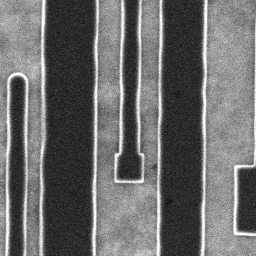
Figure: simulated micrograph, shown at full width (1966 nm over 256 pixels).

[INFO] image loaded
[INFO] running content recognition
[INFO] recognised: groups of lines, slits or small figures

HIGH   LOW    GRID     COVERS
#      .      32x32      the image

.....#######...###..######......
.....#######...###..######......
.....#######...##...######......
.....#######...##...######......
.....#######...##...######......
.....#######...###..######......
.....#######...###..######......
.....#######...###..######......
.....#######...##...######......
..#..#######...##...######......
.##..#######...##...######......
.##..#######...##...######......
.##..#######...##...######......
.##..#######...##...######......
.##..#######...##...######......
.##..#######...##...######......
.##..#######...##...######......
.##..#######...##...######......
.##..#######...##...######......
.##..#######...###..######......
.##..#######..####..######......
.##..#######..####..######...###
.##..#######...###..######...###
.##..#######........######...###
.##..#######........######...###
.##..#######........######...###
.##..#######........#####....###
.##..#######........#####....###
.##..#######........#####....###
.##..#######........#####.......
.##..#######........#####.......
.##..#######........#####.......